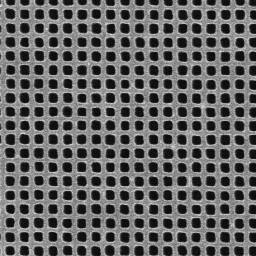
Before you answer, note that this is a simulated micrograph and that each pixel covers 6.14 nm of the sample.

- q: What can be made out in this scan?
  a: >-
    a regular array of holes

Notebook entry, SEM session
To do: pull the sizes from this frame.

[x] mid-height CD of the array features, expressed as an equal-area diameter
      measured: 9.77 pixels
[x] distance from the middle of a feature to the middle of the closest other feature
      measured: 13.7 px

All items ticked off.